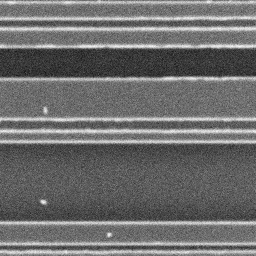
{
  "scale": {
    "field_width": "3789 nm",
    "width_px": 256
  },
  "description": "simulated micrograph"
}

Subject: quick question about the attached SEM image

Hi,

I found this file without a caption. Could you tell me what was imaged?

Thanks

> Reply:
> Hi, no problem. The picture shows lines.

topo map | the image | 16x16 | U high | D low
UUUUUUUUUUUUUUUU
UUUUUUUUUUUUUUUU
UUUUUUUUUUUUUUUU
DDDDDDDDDDDDDDDD
DDDDDDDDDDDDDDDD
UUUUUUUUUUUUUUUU
UUUUUUUUUUUUUUUU
UUUUUUUUUUUUUUUU
UUUUUUUUUUUUUUUU
DDDDDDDDDDDDDDDD
DDDDDDDDDDDDDDDD
DDDDDDDDDDDDDDDD
DDDDDDDDDDDDDDDD
DDDDDDDDDDDDDDDD
UUUUUUUUUUUUUUUU
UUUUUUUUUUUUUUUU